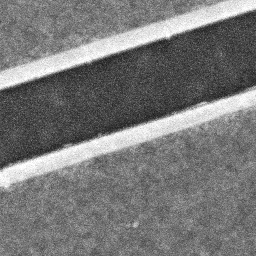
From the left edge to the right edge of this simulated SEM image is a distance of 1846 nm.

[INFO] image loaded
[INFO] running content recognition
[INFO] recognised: one or a few lines or trenches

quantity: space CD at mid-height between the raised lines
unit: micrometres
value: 0.653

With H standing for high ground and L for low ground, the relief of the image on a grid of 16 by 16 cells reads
HHHHHHHHHHHHHHHL
HHHHHHHHHHHLLLLL
HHHHHHHHLLLLLLLL
HHHHHLLLLLLLLLLL
HHLLLLLLLLLLLLLL
LLLLLLLLLLLLLLLL
LLLLLLLLLLLLLLHH
LLLLLLLLLLLHHHHH
LLLLLLLLHHHHHHHH
LLLLLHHHHHHHHHHH
LLHHHHHHHHHHHHHH
HHHHHHHHHHHHHHHH
HHHHHHHHHHHHHHHH
HHHHHHHHHHHHHHHH
HHHHHHHHHHHHHHHH
HHHHHHHHHHHHHHHH